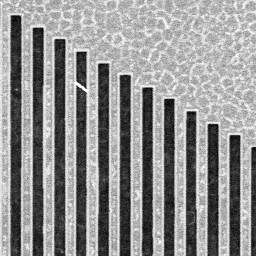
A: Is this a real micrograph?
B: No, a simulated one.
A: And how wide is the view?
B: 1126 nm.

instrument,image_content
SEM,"parallel lines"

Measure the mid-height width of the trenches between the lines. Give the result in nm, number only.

56.1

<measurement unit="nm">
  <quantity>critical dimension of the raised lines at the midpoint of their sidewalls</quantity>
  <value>43.5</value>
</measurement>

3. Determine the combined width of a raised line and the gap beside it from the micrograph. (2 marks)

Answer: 96.2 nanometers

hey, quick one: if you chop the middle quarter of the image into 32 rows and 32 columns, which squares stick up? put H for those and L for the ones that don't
LHHLLLHHLLLLHHHHHHHHHHHHHHHHHHHH
LHHLLLHHLLLLHHHHHHHHHHHHHHHHHHHH
LHHLLLHHLLLLHHLLLHHHHHHHHHHHHHHH
LHHLLLHHLLLLHHLLLHHHHHHHHHHHHHHH
LHHLLLHHLLLLHHLLLHHHHHHHHHHHHHHH
LHHLLLHHLLLLHHLLLHHHHHHHHHHHHHHH
LHHLLLHHLLLLHHLLLHHLLLHHHHHHHHHH
LHHLLLHHLLLLHHLLLHHLLLHHHHHHHHHH
LHHLLLHHLLLLHHLLLHHLLLHHHLLHHHHH
LHHLLLHHLLLLHHLLLHHLLLHHHLLLHHHH
LHHLLLHHLLLLHHLLLHHLLLHHHLLLHHHH
LHHLLLHHLLLLHHLLLHHLLLHHHLLLHHHL
LHHLLLHHLLLLHHLLLHHLLLHHHLLLHHLL
LHHLLLHHLLLLHHLLLHHLLLHHHLLLHHLL
LHHLLLHHLLLLHHLLLHHLLLHHHLLLHHLL
LHHLLLHHLLLLHHLLLHHLLLHHHLLLHHLL
LHHLLLHHLLLLHHLLLHHLLLHHHLLLHHLL
LHHLLLHHLLLLHHLLLHHLLLHHHLLLHHLL
LHHLLLHHLLLLHHLLLHHLLLHHHLLLHHLL
LHHLLLHHLLLLHHLLLHHLLLHHHLLLHHLL
LHHLLLHHLLLLHHLLLHHLLLHHHLLLHHLL
LHHLLLHHLLLLHHLLLHHLLLHHHLLLHHLL
LHHLLLHHLLLLHHLLLHHLLLHHHLLLHHLL
LHHLLLHHLLLLHHLLLHHLLLHHHLLLHHLL
LHHLLLHHLLLLHHLLLHHLLLHHHLLLHHLL
LHHLLLHHLLLLHHLLLHHLLLHHHLLLHHLL
LHHLLLHHLLLLHHLLLHHLLLHHHLLLHHLL
LHHLLLHHLLLLHHLLLHHLLLHHHLLLHHLL
LHHLLLHHLLLLHHLLLHHLLLHHHLLLHHLL
LHHLLLHHLLLLHHLLLHHLLLHHHLLLHHLL
LHHLLLHHLLLLHHLLLHHLLLHHHLLLHHLL
LHHLLLHHLLLLHHLLLHHLLLHHHLLLHHLL